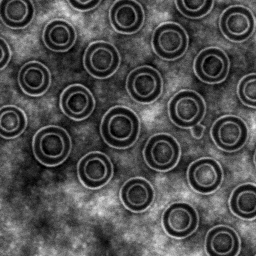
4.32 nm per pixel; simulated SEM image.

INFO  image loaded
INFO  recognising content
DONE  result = a regular array of ring-shaped raised bodies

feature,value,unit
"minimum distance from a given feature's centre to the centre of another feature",48.7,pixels